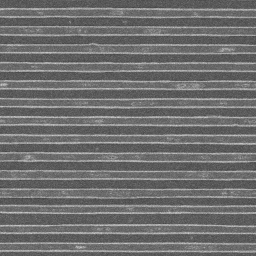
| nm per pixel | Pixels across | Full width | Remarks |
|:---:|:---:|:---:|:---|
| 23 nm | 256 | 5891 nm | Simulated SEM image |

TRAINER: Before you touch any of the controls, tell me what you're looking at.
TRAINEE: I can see parallel lines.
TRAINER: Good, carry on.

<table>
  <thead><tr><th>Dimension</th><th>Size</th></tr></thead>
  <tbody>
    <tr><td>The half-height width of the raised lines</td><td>176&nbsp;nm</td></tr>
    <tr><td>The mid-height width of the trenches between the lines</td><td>222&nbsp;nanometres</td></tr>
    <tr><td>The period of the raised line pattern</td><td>0.415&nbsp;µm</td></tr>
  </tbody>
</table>